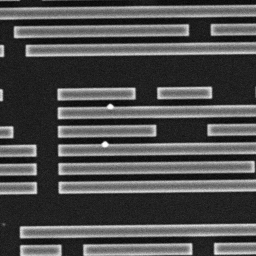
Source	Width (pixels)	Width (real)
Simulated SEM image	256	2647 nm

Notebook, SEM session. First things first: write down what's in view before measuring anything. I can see groups of lines, slits or small figures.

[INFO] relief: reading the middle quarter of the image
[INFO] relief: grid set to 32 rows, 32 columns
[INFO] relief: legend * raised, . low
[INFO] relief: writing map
................................
................................
................................
................................
................................
................................
******************......********
******************......********
******************......********
................................
...........*....................
********************************
********************************
********........................
................................
....................***.........
***********************.........
***********************.........
................................
..........*.....................
********************************
********************************
***********************.........
................................
................................
********************************
********************************
................................
................................
.....***************************
********************************
********************************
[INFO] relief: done